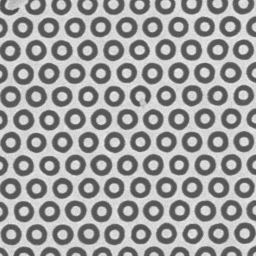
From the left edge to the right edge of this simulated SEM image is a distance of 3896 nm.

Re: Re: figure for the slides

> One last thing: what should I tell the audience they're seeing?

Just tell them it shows a regular array of ring-shaped grooves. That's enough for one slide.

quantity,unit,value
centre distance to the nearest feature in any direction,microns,0.391